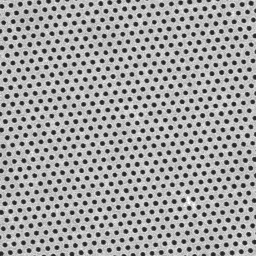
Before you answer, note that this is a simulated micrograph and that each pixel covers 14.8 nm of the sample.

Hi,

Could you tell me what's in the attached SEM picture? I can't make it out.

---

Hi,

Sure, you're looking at a regular array of holes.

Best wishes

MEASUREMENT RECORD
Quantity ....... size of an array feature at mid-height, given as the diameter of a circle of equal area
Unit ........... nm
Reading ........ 76.3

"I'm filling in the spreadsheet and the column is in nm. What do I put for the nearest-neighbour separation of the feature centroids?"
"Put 134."